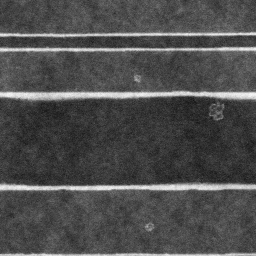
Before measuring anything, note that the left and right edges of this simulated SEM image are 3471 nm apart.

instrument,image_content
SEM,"lines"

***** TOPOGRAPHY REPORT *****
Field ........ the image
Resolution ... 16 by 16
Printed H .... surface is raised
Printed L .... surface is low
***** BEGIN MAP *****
HHHHHHHHHHHHHHHH
HHHHHHHHHHHHHHHH
HHHHHHHHHHHHHHHH
HHHHHHHHHHHHHHHH
HHHHHHHHHHHHHHHH
HHHHHHHHHHHHHHHH
LLLLLLLLLLLLLLLL
LLLLLLLLLLLLLLLL
LLLLLLLLLLLLLLLL
LLLLLLLLLLLLLLLL
LLLLLLLLLLLLLLLL
LLLLLLLLLLLLLLLL
HHHHHHHHHHHHHHHH
HHHHHHHHHHHHHHHH
HHHHHHHHHHHHHHHH
HHHHHHHHHHHHHHHH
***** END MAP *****